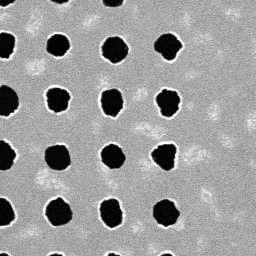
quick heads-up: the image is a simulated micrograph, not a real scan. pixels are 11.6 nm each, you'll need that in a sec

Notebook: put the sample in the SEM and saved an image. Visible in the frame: a regular array of holes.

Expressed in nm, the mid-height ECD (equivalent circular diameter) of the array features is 294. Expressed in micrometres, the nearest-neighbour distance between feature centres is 0.613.